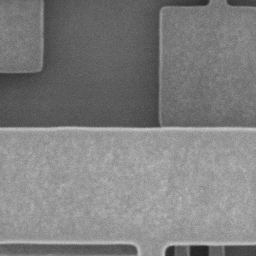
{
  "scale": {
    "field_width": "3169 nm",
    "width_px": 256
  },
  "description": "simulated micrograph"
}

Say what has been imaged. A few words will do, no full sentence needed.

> wiring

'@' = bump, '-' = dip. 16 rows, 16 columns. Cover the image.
----------------
----------------
----------------
----------------
----------------
----------------
----------------
----------------
@@@@@@@@@@@@@@@@
@@@@@@@@@@@@@@@@
@@@@@@@@@@@@@@@@
@@@@@@@@@@@@@@@@
@@@@@@@@@@@@@@@@
@@@@@@@@@@@@@@@@
@@@@@@@@@@@@@@@@
@@@@@@@@@@@-----